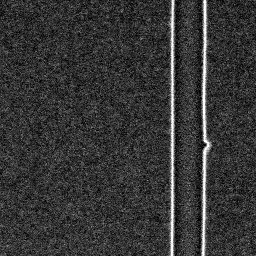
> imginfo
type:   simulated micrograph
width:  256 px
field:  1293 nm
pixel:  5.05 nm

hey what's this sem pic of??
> one or a few lines or trenches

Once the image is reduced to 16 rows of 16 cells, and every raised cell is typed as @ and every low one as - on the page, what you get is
@@@@@@@@@@@--@@@
@@@@@@@@@@@--@@@
@@@@@@@@@@@--@@@
@@@@@@@@@@@--@@@
@@@@@@@@@@@--@@@
@@@@@@@@@@@--@@@
@@@@@@@@@@@--@@@
@@@@@@@@@@@--@@@
@@@@@@@@@@@--@@@
@@@@@@@@@@@--@@@
@@@@@@@@@@@--@@@
@@@@@@@@@@@--@@@
@@@@@@@@@@@--@@@
@@@@@@@@@@@--@@@
@@@@@@@@@@@--@@@
@@@@@@@@@@@--@@@